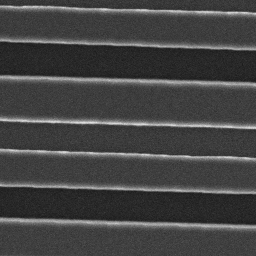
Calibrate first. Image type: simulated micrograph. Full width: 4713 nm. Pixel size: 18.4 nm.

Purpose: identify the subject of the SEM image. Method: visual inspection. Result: lines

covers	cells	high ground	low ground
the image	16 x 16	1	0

1111111111111111
1111111111111111
1111111111111111
0000000000000000
0000000000000000
1111111111111111
1111111111111111
1111111111111111
1111111111111111
1111111111111111
1111111111111111
1111111111111111
0000000000000000
0000000000000000
1111111111111111
1111111111111111